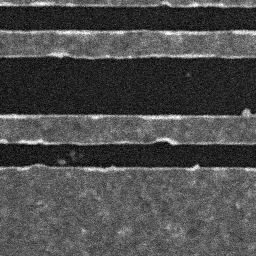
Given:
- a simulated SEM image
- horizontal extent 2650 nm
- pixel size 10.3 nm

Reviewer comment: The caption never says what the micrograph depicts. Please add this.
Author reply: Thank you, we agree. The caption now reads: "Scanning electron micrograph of one or a few lines or trenches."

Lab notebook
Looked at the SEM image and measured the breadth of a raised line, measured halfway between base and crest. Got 27.3 pixels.